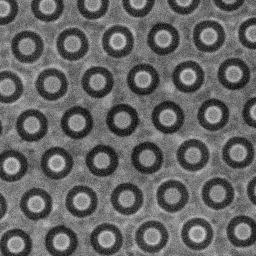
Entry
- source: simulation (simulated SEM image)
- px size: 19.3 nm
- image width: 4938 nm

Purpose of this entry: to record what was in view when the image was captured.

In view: an array of small figures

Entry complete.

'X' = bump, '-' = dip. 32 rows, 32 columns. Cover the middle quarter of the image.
XXXXXXX---XXXXXXX-----XXXXXX----
XXXXX------XXXXX-------XXXX-----
-XXXX-------XXXX---XX---XXX---XX
-XXX---XXX---XX---XXXX--XXX--XXX
-XXX---XXX---XXX--XXX---XXX---XX
-XXX---XXX--XXXX---XX---XXXX----
-XXXX-------XXXX-------XXXXX----
-XXXXX-----XXXXXXX----XXXXXXXXXX
XXXXXXX---XXXXXXXXXXXXXXXXXXXXXX
XXXXXXXXXXXXXXXXXXXXXXXX---XXXXX
XXX-XXXXXXXX-----XXXXXX------XXX
X-----XXXXX-------XXXX--------XX
-------XXXX--XXX--XXXX--XXXX--XX
--XXX--XXXX--XXXX--XXX--XXXX--XX
-XXXX--XXX---XXXX--XXX--XXX---XX
-XXXX--XXXX--XXX--XXXX--------XX
-------XXXX-------XXXXX------XXX
------XXXXXXX----XXXXXXXX--XXXXX
X----XXXXXXXXXXXXXXXXXXXXXXXXXX-
XXXXXXXXXXXXXXXXXXXX--XXXXXXXX--
XXXXXXXX----XXXXXX------XXXXX---
XXXXXX-------XXXX--------XXX---X
--XXXX---X---XXXX--XXX---XXX--XX
--XXX---XXX---XXX--XXXX--XXX--XX
---XX---XXX---XXX--XXXX--XXX---X
--XXXX--XXX--XXXX--------XXXX---
--XXXX-------XXXXX------XXXXXX--
-XXXXXX-----XXXXXXXX---XXXXXXXXX
-XXXXXXXXXXXXXXXXXXXXXXXXXXXXXXX
XXXXXXXXXXXXXXX-XXXXXXXXX-----XX
XXX---XXXXXXX------XXXXX-------X
X-------XXXX--------XXX---XX---X